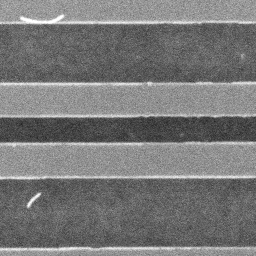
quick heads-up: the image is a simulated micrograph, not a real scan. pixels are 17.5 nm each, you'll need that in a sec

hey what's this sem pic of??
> lines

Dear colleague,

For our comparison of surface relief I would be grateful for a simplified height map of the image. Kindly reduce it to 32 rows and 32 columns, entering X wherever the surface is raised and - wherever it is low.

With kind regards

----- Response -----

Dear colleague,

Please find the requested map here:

XXXXXXXXXXXXXXXXXXXXXXXXXXXXXXXX
XXXXXXXXXXXXXXXXXXXXXXXXXXXXXXXX
XXXXXXXXXXXXXXXXXXXXXXXXXXXXXXXX
--------------------------------
--------------------------------
--------------------------------
--------------------------------
--------------------------------
--------------------------------
--------------------------------
XXXXXXXXXXXXXXXXXXXXXXXXXXXXXXXX
XXXXXXXXXXXXXXXXXXXXXXXXXXXXXXXX
XXXXXXXXXXXXXXXXXXXXXXXXXXXXXXXX
XXXXXXXXXXXXXXXXXXXXXXXXXXXXXXXX
XXXXXXXXXXXXXXXXXXX----XX-XX--X-
--------------------------------
--------------------------------
--------------------------------
XXXXXXXXXXXXXXXXXXXXXXXXXXXXXXXX
XXXXXXXXXXXXXXXXXXXXXXXXXXXXXXXX
XXXXXXXXXXXXXXXXXXXXXXXXXXXXXXXX
XXXXXXXXXXXXXXXXXXXXXXXXXXXXXXXX
--------------------------------
--------------------------------
--------------------------------
--------------------------------
--------------------------------
--------------------------------
--------------------------------
--------------------------------
--------------------------------
XXXXXXXXXXXXXXXXXXXXXXXXXXXXXXXX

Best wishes